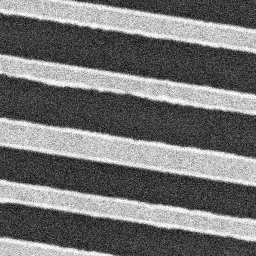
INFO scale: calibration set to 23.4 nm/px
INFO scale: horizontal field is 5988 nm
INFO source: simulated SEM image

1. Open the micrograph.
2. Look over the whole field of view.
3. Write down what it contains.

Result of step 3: one or a few lines or trenches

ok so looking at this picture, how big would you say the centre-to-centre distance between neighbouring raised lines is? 1460 nm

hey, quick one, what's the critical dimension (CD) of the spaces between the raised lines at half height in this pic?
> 1050 nanometres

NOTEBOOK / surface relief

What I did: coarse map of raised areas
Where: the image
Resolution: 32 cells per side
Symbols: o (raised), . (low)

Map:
oooooooooo......................
.ooooooooooooooo................
........oooooooooooooo..........
..............ooooooooooooooo...
....................oooooooooooo
..........................oooooo
................................
ooo.............................
ooooooooo.......................
...ooooooooooooo................
..........oooooooooooo..........
...............ooooooooooooo....
.....................ooooooooooo
...........................ooooo
................................
ooo.............................
oooooooooo......................
oooooooooooooooo................
...ooooooooooooooooooo..........
.........ooooooooooooooooooo....
................oooooooooooooooo
......................oooooooooo
............................oooo
ooooo...........................
ooooooooooo.....................
....ooooooooooooo...............
..........oooooooooooooo........
.................ooooooooooooo..
.......................ooooooooo
.............................ooo
ooo.............................
oooooooooo......................